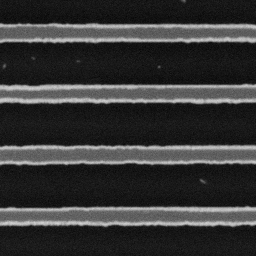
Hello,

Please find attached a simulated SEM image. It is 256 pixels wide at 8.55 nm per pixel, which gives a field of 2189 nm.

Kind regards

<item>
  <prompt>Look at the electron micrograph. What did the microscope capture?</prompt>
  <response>lines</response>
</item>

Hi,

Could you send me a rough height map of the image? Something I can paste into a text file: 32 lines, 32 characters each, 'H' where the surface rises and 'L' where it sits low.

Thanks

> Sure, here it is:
LLLLLLLLLLLLLLLLLLLLLLLLLLLLLLLL
LLLLLLLLLLLLLLLLLLLLLLLLLLLLLLLL
LLLLLLLLLLLLLLLLLLLLLLLLLLLLLLLL
HHHHHHHHHHHHHHHHHHHHHHHHHHHHHHHH
HHHHHHHHHHHHHHHHHHHHHHHHHHHHHHHH
LLLLLLLLLLLLLLLLLLLLLLLLLLLLLLLL
LLLLLLLLLLLLLLLLLLLLLLLLLLLLLLLL
LLLLLLLLLLLLLLLLLLLLLLLLLLLLLLLL
LLLLLLLLLLLLLLLLLLLLLLLLLLLLLLLL
LLLLLLLLLLLLLLLLLLLLLLLLLLLLLLLL
LLLLLLLLLLLLLLLLLLLLLLLLLLLLLLLL
HHHHHHHHHHHHHHHHHHHHHHHHHHHHHHHH
HHHHHHHHHHHHHHHHHHHHHHHHHHHHHHHH
LLLLLLLLLLLLLLLLLLLLLLLLLLLLLLLL
LLLLLLLLLLLLLLLLLLLLLLLLLLLLLLLL
LLLLLLLLLLLLLLLLLLLLLLLLLLLLLLLL
LLLLLLLLLLLLLLLLLLLLLLLLLLLLLLLL
LLLLLLLLLLLLLLLLLLLLLLLLLLLLLLLL
HHHHHHHHHHHHHHHHHHHHHHHHHHHHHHHH
HHHHHHHHHHHHHHHHHHHHHHHHHHHHHHHH
LLLLHLLLLLLLLLLLLLLLLLLLLLLLLLLL
LLLLLLLLLLLLLLLLLLLLLLLLLLLLLLLL
LLLLLLLLLLLLLLLLLLLLLLLLLLLLLLLL
LLLLLLLLLLLLLLLLLLLLLLLLLLLLLLLL
LLLLLLLLLLLLLLLLLLLLLLLLLLLLLLLL
LLLLLLLLLLLLLLLLLLLLLLLLLLLLLLLL
HHHHHHHHHHHHHHHHHHHHHHHHHHHHHHHH
HHHHHHHHHHHHHHHHHHHHHHHHHHHHHHHH
LLLLLLLLLLLLLLLLLLLLLLLLLLLLLLLL
LLLLLLLLLLLLLLLLLLLLLLLLLLLLLLLL
LLLLLLLLLLLLLLLLLLLLLLLLLLLLLLLL
LLLLLLLLLLLLLLLLLLLLLLLLLLLLLLLL